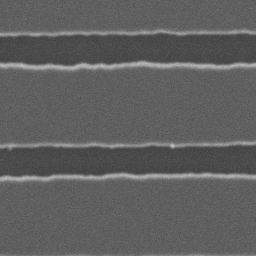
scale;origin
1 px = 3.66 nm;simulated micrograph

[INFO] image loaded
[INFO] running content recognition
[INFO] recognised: lines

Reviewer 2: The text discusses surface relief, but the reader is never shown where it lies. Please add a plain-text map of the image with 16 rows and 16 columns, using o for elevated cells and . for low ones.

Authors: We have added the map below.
oooooooooooooooo
oooooooooooooooo
................
................
oooooooooooooooo
oooooooooooooooo
oooooooooooooooo
oooooooooooooooo
oooooooooooooooo
................
................
oooooooooooooooo
oooooooooooooooo
oooooooooooooooo
oooooooooooooooo
oooooooooooooooo